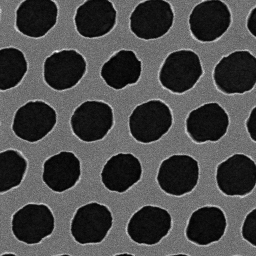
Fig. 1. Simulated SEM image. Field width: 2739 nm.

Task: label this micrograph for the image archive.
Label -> a regular array of holes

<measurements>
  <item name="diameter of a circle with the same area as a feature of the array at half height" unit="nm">437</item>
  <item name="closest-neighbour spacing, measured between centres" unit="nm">616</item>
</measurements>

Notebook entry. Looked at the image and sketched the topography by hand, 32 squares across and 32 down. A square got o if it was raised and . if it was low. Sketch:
ooo....ooo....oooo...oooo...oooo
oo.....ooo....ooo.....oo.....oo.
oo.....oo.....oo......oo.....oo.
oo....oooo....oo.....ooo....ooo.
oooo.ooooo...oooo...oooo...ooooo
oooooooooooooooooooooooooooooooo
...oooo...ooooo..ooooo..ooooo..o
...ooo.....ooo...oooo....ooo....
...oo......oo.....oo.....oo.....
...ooo....ooo....ooo.....oo.....
..oooo...oooo...oooo....ooo.....
oooooooooooooooooooooo.ooooo...o
oooooooooooooooooooooooooooooooo
oo....oooo....ooo....oooo...oooo
oo.....oo.....oo.....ooo....ooo.
oo.....oo.....oo.....oo......oo.
oo....ooo....ooo.....ooo....ooo.
ooo..ooooo..ooooo...oooo...ooooo
oooooooooooooooooooooooooooooooo
...oooo..ooooo...ooooo..ooooo..o
...ooo....ooo.....oo.....ooo....
...oo.....ooo.....oo.....oo.....
...oo.....ooo....ooo.....oo.....
.ooooo...oooo...oooo....ooo.....
oooooooooooooooooooooooooooooooo
ooooooooooo.oooooooooooooooooooo
oo....oooo....ooo....ooo....ooo.
oo.....oo.....oo.....ooo....ooo.
oo.....oo.....oo.....oo.....oo..
oo....ooo....ooo.....oo.....oo..
ooooooooooooooooooooooooo.oooooo
oooooooooooooooooooooooooooooooo